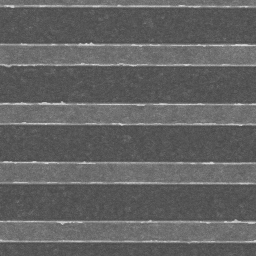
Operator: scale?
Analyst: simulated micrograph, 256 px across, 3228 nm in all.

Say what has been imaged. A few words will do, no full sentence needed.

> parallel lines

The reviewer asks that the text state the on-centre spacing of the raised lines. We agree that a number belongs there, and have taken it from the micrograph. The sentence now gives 742 nanometers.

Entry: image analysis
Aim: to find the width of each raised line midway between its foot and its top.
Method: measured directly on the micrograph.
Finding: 263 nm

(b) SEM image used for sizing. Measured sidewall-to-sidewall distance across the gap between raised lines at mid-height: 0.482 µm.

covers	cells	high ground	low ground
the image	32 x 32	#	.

################################
................................
................................
................................
................................
..........##....................
################################
################################
................................
................................
................................
................................
................................
################################
################################
################################
................................
................................
................................
................................
################################
################################
################################
................................
................................
................................
................................
................................
################################
################################
................................
................................